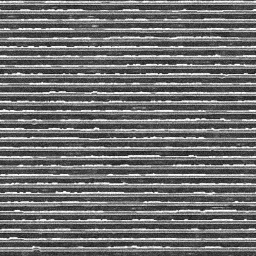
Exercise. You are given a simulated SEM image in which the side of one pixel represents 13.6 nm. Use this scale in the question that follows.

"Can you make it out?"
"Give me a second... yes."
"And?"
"parallel lines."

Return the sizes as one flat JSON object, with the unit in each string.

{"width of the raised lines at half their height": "47.4 nm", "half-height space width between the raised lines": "5.12 pixels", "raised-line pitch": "0.123 micrometres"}